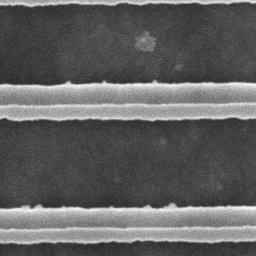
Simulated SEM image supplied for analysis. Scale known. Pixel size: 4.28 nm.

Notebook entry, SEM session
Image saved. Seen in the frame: lines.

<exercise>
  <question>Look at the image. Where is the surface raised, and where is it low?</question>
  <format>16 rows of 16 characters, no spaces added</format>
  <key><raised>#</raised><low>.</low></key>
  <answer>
................
................
................
................
................
################
################
................
................
................
................
................
................
################
################
................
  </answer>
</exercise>